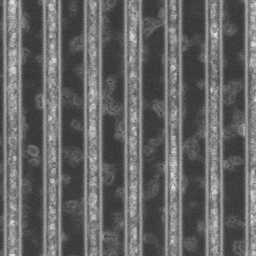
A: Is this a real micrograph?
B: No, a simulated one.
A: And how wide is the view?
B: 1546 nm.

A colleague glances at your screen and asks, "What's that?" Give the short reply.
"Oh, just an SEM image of parallel lines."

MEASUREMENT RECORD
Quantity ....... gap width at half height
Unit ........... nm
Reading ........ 83.7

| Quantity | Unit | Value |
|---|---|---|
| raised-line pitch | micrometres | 0.244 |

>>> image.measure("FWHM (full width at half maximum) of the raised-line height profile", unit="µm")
0.158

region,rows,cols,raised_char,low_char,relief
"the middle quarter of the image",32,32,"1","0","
11111000011111100001111111000111
11111000011111100001111111000111
11111000011111100001111111000111
11111000011111100001111111000111
11111000011111100001111111000111
11111000011111100001111111000111
11111000011111100001111111000111
11111000011111100001111111000111
11111000011111100001111111000111
11111000011111100001111111000111
11111000011111100001111111000111
11111000011111100001111111000111
11111000011111100001111111000111
11111000011111100001111111000111
11111000011111100001111111000111
11111000011111100001111111000111
11111000011111100001111111000111
11111000011111100001111111000111
11111000011111100001111111000111
11111000011111100001111111000111
11111000011111100001111111000111
11111000011111100001111111000111
11111000011111100001111111000111
11111000011111100001111111000111
11111000011111100001111111000111
11111000011111100001111111000111
11111000011111100001111111000111
11111000011111100001111111000111
11111000011111100001111111000111
11111000011111100001111111000111
11111000011111100001111111000111
11111000011111100001111111000111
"